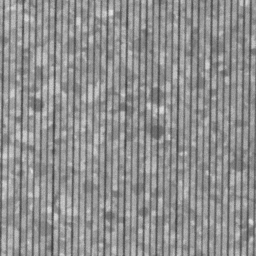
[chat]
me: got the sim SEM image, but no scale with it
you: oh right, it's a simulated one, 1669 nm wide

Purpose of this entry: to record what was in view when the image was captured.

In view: parallel lines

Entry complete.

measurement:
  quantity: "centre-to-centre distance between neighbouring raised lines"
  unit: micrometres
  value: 0.0423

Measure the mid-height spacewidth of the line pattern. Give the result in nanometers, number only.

13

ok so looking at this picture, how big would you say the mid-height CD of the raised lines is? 26.1 nm